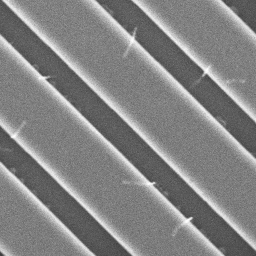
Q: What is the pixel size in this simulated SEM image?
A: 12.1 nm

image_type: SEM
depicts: lines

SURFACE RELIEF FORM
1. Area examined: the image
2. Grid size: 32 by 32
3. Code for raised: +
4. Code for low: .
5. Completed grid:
.+++++++++++.....+++++++++++....
..+++++++++++.....+++++++++++...
...+++++++++++.....+++++++++++..
....+++++++++++.....+++++++++++.
.....++++++++++++....+++++++++++
+.....+++++++++++.....++++++++++
++.....+++++++++++.....+++++++++
+++.....+++++++++++.....++++++++
++++.....+++++++++++.....+++++++
+++++.....+++++++++++.....++++++
++++++.....+++++++++++.....+++++
+++++++.....+++++++++++.....++++
++++++++.....+++++++++++.....+++
+++++++++.....++++++++++++....++
++++++++++.....+++++++++++.....+
+++++++++++.....++++++++++++....
.+++++++++++.....++++++++++++...
..+++++++++++.....+++++++++++...
...+++++++++++.....++++++++++++.
....+++++++++++.....++++++++++++
.....+++++++++++.....+++++++++++
+.....+++++++++++.....++++++++++
++.....+++++++++++.....+++++++++
+++.....+++++++++++.....++++++++
++++.....+++++++++++.....+++++++
+++++.....+++++++++++.....++++++
++++++.....+++++++++++.....+++++
+++++++.....++++++++++++....++++
++++++++.....+++++++++++.....+++
+++++++++.....+++++++++++.....++
++++++++++.....++++++++++++....+
+++++++++++.....++++++++++++....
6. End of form